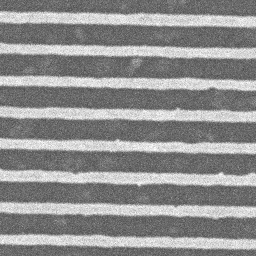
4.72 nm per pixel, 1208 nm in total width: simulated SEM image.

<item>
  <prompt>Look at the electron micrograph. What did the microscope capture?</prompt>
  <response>parallel lines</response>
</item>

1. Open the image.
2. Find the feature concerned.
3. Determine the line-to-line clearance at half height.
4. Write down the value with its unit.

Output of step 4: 0.103 microns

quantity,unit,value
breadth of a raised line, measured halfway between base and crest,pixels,10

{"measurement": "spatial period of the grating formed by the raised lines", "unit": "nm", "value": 150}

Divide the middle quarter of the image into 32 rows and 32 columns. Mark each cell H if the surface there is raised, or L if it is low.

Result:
LLLLLLLLLLLLLLLLLLLLLLLLLLLLLLLL
LLLLLLLLLLLLLLLLLLLLLLLLLLLLLLLL
LLLLLLLLLLLLLLLLLLLLLLLLLLLLLLLL
HHHLLLLLLLLLLLLLLLLLLLLLLLLLLLLL
HHHHHHHHHHHHHHHHHHHHHHHHHHHHHHHH
HHHHHHHHHHHHHHHHHHHHHHHHHHHHHHHH
LLLLLLLLLLLLLLLLLLLLLLLLLLLLLLLL
LLLLLLLLLLLLLLLLLLLLLLLLLLLLLLLL
LLLLLLLLLLLLLLLLLLLLLLLLLLLLLLLL
LLLLLLLLLLLLLLLLLLLLLLLLLLLLLLLL
LLLLLLLLLLLLLLLLLLLLLLLLLLLLLLLL
HHHHHHHLLHHHHHHHLLLLLLLLLLLLHLLL
HHHHHHHHHHHHHHHHHHHHHHHHHHHHHHHH
HHHHHHHHHLHHLLHHHHHHHHHHHHHHHHHH
LLLLLLLLLLLLLLLLLLLLLLLLLLLLLLLL
LLLLLLLLLLLLLLLLLLLLLLLLLLLLLLLL
LLLLLLLLLLLLLLLLLLLLLLLLLLLLLLLL
LLLLLLLLLLLLLLLLLLLLLLLLLLLLLLLL
LLLLLLLLLLLLLLLLLLLLLLLLLLLLLLLL
HHHHHHHHHHHHHHHHHLLLLLLLLLLLLLLL
HHHHHHHHHHHHHHHHHHHHHHHHHHHHHHHH
LLLLLLHHHHHHHHLHHHHHHHHHHHHHHHHH
LLLLLLLLLLLLLLLLLLLLLLLLLLLLLLLL
LLLLLLLLLLLLLLLLLLLLLLLLLLLLLLLL
LLLLLLLLLLLLLLLLLLLLLLLLLLLLLLLL
LLLLLLLLLLLLLLLLLLLLLLLLLLLLLLLL
LLLLLLLLLLLLLLLLLLLLLLLLLLLLLLLL
HHLLHHHHHHHHHHHHHHHHHHLLHLHHHHLL
HHHHHHHHHHHHHHHHHHHHHHHHHHHHHHHH
HHLHHLLLHHHHHHHHHHHHHHHHHHHHHHHH
LLLLLLLLLLLLLLLLLLLLLLLLLLLLLLLL
LLLLLLLLLLLLLLLLLLLLLLLLLLLLLLLL